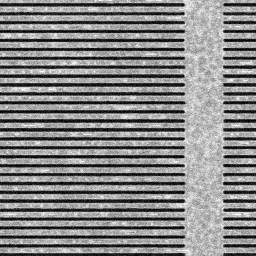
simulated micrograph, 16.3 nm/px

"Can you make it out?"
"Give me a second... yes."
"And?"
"parallel lines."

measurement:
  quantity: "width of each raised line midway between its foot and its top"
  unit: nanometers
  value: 79.7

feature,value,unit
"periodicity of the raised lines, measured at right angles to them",0.146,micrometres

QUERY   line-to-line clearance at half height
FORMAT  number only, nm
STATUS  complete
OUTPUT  63.3